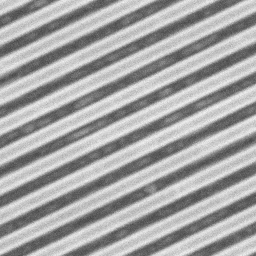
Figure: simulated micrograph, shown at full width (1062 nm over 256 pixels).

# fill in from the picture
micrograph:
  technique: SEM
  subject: parallel lines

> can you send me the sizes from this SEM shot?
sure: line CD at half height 58.8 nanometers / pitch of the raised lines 112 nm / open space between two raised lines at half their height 0.0514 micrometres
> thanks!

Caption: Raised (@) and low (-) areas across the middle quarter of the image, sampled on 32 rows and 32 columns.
@@@@--------@@@@@@@@-------@@@@@
@@--------@@@@@@@--------@@@@@@@
-------@@@@@@@@--------@@@@@@@@-
-----@@@@@@@@--------@@@@@@@@---
---@@@@@@@@--------@@@@@@@@-----
-@@@@@@@@--------@@@@@@@@-------
@@@@@@@--------@@@@@@@@-------@@
@@@@@--------@@@@@@@@-------@@@@
@@@--------@@@@@@@@-------@@@@@@
@--------@@@@@@@@-------@@@@@@@@
-------@@@@@@@@-------@@@@@@@@--
-----@@@@@@@@-------@@@@@@@@----
---@@@@@@@@-------@@@@@@@@------
-@@@@@@@--------@@@@@@@@-------@
@@@@@@--------@@@@@@@@-------@@@
@@@@--------@@@@@@@@-------@@@@@
@@--------@@@@@@@--------@@@@@@@
-------@@@@@@@@--------@@@@@@@@-
-----@@@@@@@@--------@@@@@@@@---
---@@@@@@@@--------@@@@@@@@-----
-@@@@@@@@--------@@@@@@@--------
@@@@@@@-------@@@@@@@@--------@@
@@@@@-------@@@@@@@@--------@@@@
@@@-------@@@@@@@@--------@@@@@@
@-------@@@@@@@@--------@@@@@@@@
------@@@@@@@@--------@@@@@@@@--
----@@@@@@@@--------@@@@@@@@----
--@@@@@@@@--------@@@@@@@@------
@@@@@@@@--------@@@@@@@@-------@
@@@@@@--------@@@@@@@@-------@@@
@@@@--------@@@@@@@@-------@@@@@
@@--------@@@@@@@@-------@@@@@@@